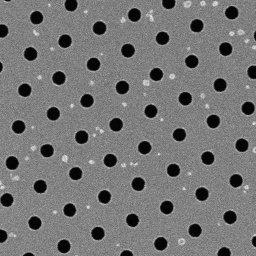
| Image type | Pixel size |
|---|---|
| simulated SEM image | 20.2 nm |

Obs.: a regular array of holes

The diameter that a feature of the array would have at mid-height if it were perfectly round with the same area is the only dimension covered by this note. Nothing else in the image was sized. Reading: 277 nm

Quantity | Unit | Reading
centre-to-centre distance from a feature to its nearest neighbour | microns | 0.736